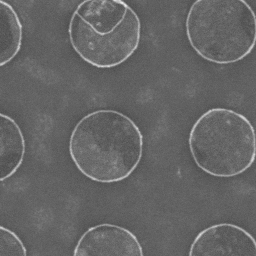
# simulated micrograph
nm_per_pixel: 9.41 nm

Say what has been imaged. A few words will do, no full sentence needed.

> raised bodies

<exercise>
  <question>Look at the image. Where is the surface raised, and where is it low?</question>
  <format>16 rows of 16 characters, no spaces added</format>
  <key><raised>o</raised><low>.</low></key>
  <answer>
o...........oooo
o...oo.oo...oooo
o...ooooo...oooo
o....ooo.....oo.
................
................
................
o....ooo....ooo.
o....oooo...oooo
o...ooooo...oooo
o....ooo.....oo.
................
................
................
o....ooo.....oo.
oo...oooo...oooo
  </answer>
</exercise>